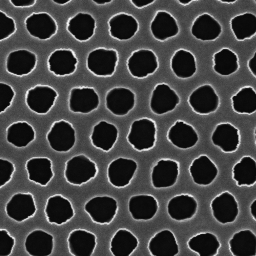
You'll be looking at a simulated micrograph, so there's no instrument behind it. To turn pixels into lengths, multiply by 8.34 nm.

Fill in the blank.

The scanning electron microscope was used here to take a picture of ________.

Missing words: a regular array of holes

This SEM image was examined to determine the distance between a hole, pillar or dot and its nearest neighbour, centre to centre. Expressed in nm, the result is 334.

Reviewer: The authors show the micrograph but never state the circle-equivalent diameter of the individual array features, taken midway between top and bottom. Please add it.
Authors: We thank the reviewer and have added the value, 220 nm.